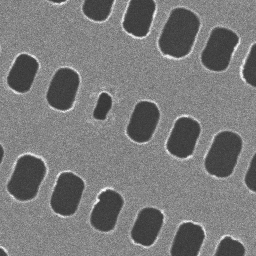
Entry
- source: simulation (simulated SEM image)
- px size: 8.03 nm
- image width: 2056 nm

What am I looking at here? a regular array of holes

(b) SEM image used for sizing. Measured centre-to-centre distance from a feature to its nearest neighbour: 346 nm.